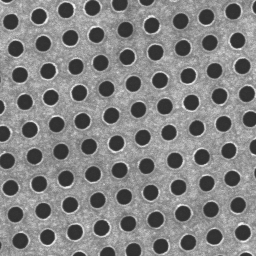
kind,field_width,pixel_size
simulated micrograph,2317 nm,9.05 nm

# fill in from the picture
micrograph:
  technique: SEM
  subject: a regular array of holes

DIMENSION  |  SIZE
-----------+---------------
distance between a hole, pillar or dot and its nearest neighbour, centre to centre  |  241 nm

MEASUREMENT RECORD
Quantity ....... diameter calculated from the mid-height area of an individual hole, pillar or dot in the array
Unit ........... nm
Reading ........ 139